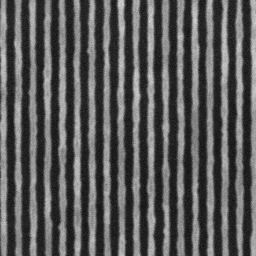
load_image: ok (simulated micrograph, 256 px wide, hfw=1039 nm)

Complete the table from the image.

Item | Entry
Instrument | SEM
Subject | parallel lines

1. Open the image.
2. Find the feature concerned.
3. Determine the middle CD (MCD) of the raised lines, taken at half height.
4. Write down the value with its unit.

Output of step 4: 19.8 nanometres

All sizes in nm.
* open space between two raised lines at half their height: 39.1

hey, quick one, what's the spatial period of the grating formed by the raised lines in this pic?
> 59.9 nm